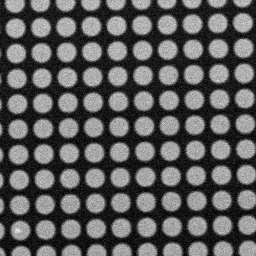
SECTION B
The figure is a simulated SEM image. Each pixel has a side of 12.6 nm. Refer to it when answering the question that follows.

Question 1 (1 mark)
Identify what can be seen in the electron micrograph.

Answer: an array of small figures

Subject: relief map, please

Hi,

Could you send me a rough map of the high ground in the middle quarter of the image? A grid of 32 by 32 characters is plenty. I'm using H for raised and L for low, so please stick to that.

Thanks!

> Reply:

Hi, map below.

LLLLLLLLLLLLLLLLLLLLLLLLLLLLLLLL
HHLLLLHHHLLLHHHLLLHHHLLLHHHHLLHH
HHHLLHHHHLLHHHHHLLHHHHLLHHHHLLHH
HHHLLHHHHLLHHHHHLLHHHHLLHHHHLLHH
HHHLLHHHHLLLHHHLLLHHHLLLLHHHLLLH
HHLLLLLLLLLLLLLLLLLLLLLLLLLLLLLL
LLLLLLLLLLLLLLLLLLLLLLLLLLLLLLLL
LLLLLLHHLLLLHHHLLLHHHLLLLHHHLLLH
HHHLLHHHHLLHHHHHLLHHHHLLHHHHLLHH
HHHLLHHHHLLHHHHHLLHHHHLLHHHHLLHH
HHHLLHHHHLLLHHHHLLHHHHLLHHHHLLLH
HHLLLLHHLLLLLHHLLLLLLLLLLLLLLLLL
LLLLLLLLLLLLLLLLLLLLLLLLLLLLLLLL
LLLLLLLLLLLLLLLLLLLHHLLLLHHHLLLH
HHHLLLHHHLLLHHHHLLHHHHLLHHHHLLLH
HHHLLHHHHHLLHHHHLLHHHHLLHHHHHLLH
HHHLLHHHHHLLHHHHLLHHHHLLHHHHLLLH
HHHLLLHHHLLLHHHLLLLHHLLLLLHLLLLL
LLLLLLLLLLLLLLLLLLLLLLLLLLLLLLLL
LLLLLLLLLLLLLLLLLLLLLLLLLLLLLLLL
HHHLLLHHHLLLHHHHLLHHHHLLLHHHLLLH
HHHLLHHHHHLLHHHHLLHHHHLLHHHHHLLH
HHHLLHHHHHLLHHHHLLHHHHLLHHHHHLLH
HHHLLLHHHHLLHHHHLLLHHHLLLHHHLLLL
HHLLLLLLLLLLLLLLLLLLLLLLLLLLLLLL
LLLLLLLLLLLLLLLLLLLLLLLLLLLLLLLL
LHLLLLLHHLLLLHHLLLLHHHLLLHHHLLLH
HHHLLLHHHHLLHHHHLLHHHHHLLHHHHLLH
HHHHLLHHHHLLHHHHLLHHHHHLLHHHHLLH
HHHHLLHHHHLLHHHHLLHHHHLLLHHHLLLH
HHHLLLHHHLLLLHHLLLLLLLLLLLLLLLLL
LLLLLLLLLLLLLLLLLLLLLLLLLLLLLLLL